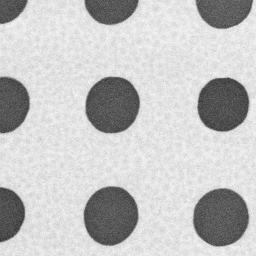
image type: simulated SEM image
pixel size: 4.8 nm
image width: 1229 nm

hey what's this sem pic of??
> holes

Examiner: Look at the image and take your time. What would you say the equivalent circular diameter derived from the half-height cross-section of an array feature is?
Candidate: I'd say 271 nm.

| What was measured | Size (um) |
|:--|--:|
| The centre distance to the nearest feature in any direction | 0.53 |